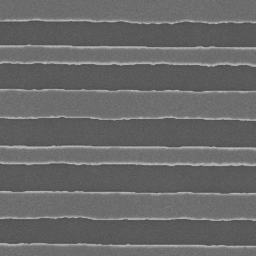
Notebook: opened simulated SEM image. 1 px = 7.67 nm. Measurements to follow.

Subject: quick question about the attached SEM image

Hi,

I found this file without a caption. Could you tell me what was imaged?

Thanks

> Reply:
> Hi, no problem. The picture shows lines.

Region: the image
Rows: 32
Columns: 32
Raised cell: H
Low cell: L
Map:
HHHHHHHHHHHHHHHHHHHHHHHHHHHHHHHH
HHHHHHHHHHHHHHHHHHHHHHHHHHHHHHHH
HHHHLHHHHHHHHHHHHHHHHHHHHHHHHHHH
LLLLLLLLLLLLLLLLLLLLLLLLLLLLLLLL
LLLLLLLLLLLLLLLLLLLLLLLLLLLLLLLL
LLLLLLLLLLLLLLLLLLLLLLLLLLLLLLLL
HHHHHHHHHHHHHHHHHHHHHHHHHHHHHHHH
HHHHHHHHHHHHHHHHHHHHHHHHHHHHHHHH
LLLLLLLLLLLLLLLLLLLLLLLLLLLLLLLL
LLLLLLLLLLLLLLLLLLLLLLLLLLLLLLLL
LLLLLLLLLLLLLLLLLLLLLLLLLLLLLLLL
HHHHHHHHHHHHHHHHHHHHHHHHLHHHHHHH
HHHHHHHHHHHHHHHHHHHHHHHHHHHHHHHH
HHHHHHHHHHHHHHHHHHHHHHHHHHHHHHHH
HHHHHHHHHHHHHHHHHHHHHHHHHHHHHHHH
LLLLLLLLLLLLLLLLLLLLLLLLLLLLLLLL
LLLLLLLLLLLLLLLLLLLLLLLLLLLLLLLL
LLLLLLLLLLLLLLLLLLLLLLLLLLLLLLLL
HHHHHHHHHHHHHHHHHHHHHHHHHHHHHHHH
HHHHHHHHHHHHHHHHHHHHHHHHHHHHHHHH
LLLHLLLLLHHHLLLLLHHHHHHHHHHHHHHH
LLLLLLLLLLLLLLLLLLLLLLLLLLLLLLLL
LLLLLLLLLLLLLLLLLLLLLLLLLLLLLLLL
LLLLLLLLLLLLLLLLLLLLLLLLLLLLLLLL
HHHHHHHHHHHHHHHHHHHHHHHHHHHHHHHH
HHHHHHHHHHHHHHHHHHHHHHHHHHHHHHHH
HHHHHHHHHHHHHHHHHHHHHHHHHHHHHHHH
LLLLLLLLLLLLLLLLLLLLLLLLLLHHHLLH
LLLLLLLLLLLLLLLLLLLLLLLLLLLLLLLL
LLLLLLLLLLLLLLLLLLLLLLLLLLLLLLLL
HLHLHLLLLLLLLLLLLLLLLLLLLLLLLLLL
HHHHHHHHHHHHHHHHHHHHHHHHHHHHHHHH